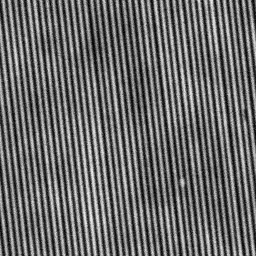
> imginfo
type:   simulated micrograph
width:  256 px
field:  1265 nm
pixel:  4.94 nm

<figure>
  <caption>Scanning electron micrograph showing parallel lines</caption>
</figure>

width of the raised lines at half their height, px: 2.73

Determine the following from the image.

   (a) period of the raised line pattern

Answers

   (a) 31 nm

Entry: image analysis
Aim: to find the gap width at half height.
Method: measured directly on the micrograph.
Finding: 18.4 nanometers